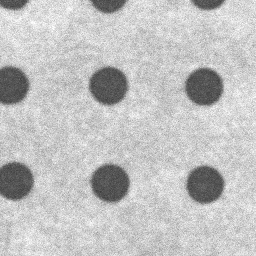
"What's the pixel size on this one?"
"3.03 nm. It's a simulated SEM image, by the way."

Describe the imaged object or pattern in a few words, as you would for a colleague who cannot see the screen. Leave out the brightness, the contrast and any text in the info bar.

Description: holes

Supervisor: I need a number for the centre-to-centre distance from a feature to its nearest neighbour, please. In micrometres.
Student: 0.288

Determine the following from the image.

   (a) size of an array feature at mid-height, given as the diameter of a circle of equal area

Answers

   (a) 119 nm